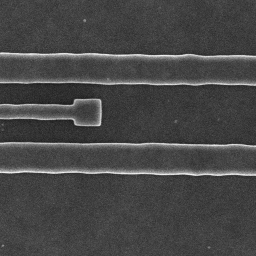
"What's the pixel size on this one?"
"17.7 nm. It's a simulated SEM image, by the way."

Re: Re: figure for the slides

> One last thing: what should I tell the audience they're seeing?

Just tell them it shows groups of lines, slits or small figures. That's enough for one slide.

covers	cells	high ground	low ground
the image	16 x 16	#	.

................
................
................
#############.##
################
................
....##..........
....##..........
................
################
################
................
................
................
................
................